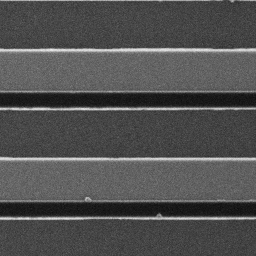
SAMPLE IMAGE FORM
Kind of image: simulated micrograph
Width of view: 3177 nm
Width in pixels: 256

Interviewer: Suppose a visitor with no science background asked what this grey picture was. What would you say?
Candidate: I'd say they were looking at lines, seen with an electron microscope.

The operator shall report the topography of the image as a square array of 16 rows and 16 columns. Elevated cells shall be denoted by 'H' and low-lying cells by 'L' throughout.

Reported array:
LLLLLLLLLLLLLLLL
LLLLLLLLLLLLLLLL
LLLLLLLLLLLLLLLL
HHHHHHHHHHHHHHHH
HHHHHHHHHHHHHHHH
HHHHHHHHHHHHHHHH
HHHHHHHHHHHHHHHH
LLLLLLLLLLLLLLLL
LLLLLLLLLLLLLLLL
LLLLLLLLLLLLLLLL
HHHHHHHHHHHHHHHH
HHHHHHHHHHHHHHHH
HHHHHHHHHHHHHHHH
HHHHHHHHHHHHHHHH
LLLLLLLLLLLLLLLL
LLLLLLLLLLLLLLLL